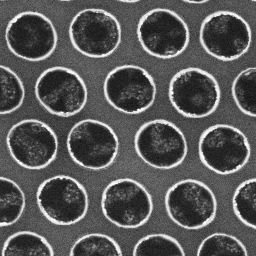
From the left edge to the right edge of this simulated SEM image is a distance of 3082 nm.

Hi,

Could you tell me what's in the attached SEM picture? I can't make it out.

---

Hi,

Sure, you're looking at a regular array of raised bodies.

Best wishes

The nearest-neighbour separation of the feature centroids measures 756 nm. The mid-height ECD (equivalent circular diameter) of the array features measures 0.584 microns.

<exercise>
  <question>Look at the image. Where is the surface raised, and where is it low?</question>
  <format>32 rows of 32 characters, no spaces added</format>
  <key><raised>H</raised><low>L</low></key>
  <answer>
LLLLLLLLLLLLLLLLLLLLLLLLLLLLLLLL
LLLLLLLLLLHHHLLLLLLHHLLLLLLLLLLL
LLHHHHLLLHHHHHLLLLHHHHHLLLHHHHLL
LHHHHHHLLHHHHHHLLHHHHHHLLHHHHHHL
LHHHHHHLLHHHHHHLLHHHHHHLLHHHHHHL
LHHHHHHLLHHHHHHLLLHHHHHLLHHHHHHL
LLHHHHLLLLHHHHLLLLLHHHHLLLHHHHLL
LLLLLLLLLLLLLLLLLLLLLLLLLLLLLLLL
HLLLLLLLLLLLLLLHHLLLLLLLLLLLLLLL
HHLLLHHHHHLLLLHHHHHLLLHHHHLLLLHH
HHHLLHHHHHLLLHHHHHHLLHHHHHHLLHHH
HHHLLHHHHHHLLHHHHHHLLHHHHHHLLHHH
HHHLLHHHHHHLLLHHHHHLLHHHHHHLLHHH
HHLLLLHHHHLLLLLHHHLLLLHHHHHLLLHH
LLLLLLLLLLLLLLLLLLLLLLLLHLLLLLLL
LLHHHLLLLLHHHLLLLLHHHLLLLLLLLLLL
LHHHHHHLLHHHHHLLLHHHHHHLLLHHHHLL
LHHHHHHLHHHHHHHLLHHHHHHLLHHHHHHL
LHHHHHHLHHHHHHHLLHHHHHHLLHHHHHHL
LLHHHHHLLHHHHHLLLLHHHHHLLHHHHHHL
LLLHHHLLLLHHHHLLLLLHHHLLLLHHHHLL
LLLLLLLLLLLLLLLLLLLLLLLLLLLHHLLL
HLLLLLHHHLLLLLLHLLLLLLLLLLLLLLLL
HHLLLHHHHHLLLHHHHHLLLHHHHHLLLLHH
HHHLLHHHHHHLLHHHHHHLLHHHHHHLLHHH
HHHLLHHHHHHLLHHHHHHLLHHHHHHLLHHH
HHHLLHHHHHHLLHHHHHHLLHHHHHHLLHHH
HHLLLLHHHHLLLLHHHHLLLLHHHHLLLLHH
LLLLLLLLLLLLLLLLLLLLLLLHLLLLLLLL
LLHHHLLLLLLHHLLLLLLHLLLLLLHHHLLL
LHHHHHLLLHHHHHLLLHHHHHLLLHHHHHLL
HHHHHHLLLHHHHHHLLHHHHHHLLHHHHHHL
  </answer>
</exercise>